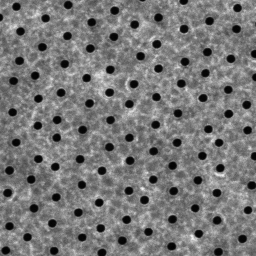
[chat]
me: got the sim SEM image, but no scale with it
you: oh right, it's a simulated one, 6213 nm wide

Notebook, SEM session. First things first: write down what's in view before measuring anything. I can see a regular array of holes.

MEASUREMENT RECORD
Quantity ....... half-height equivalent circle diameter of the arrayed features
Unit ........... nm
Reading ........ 216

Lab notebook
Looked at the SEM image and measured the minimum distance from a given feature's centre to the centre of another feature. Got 562 nm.